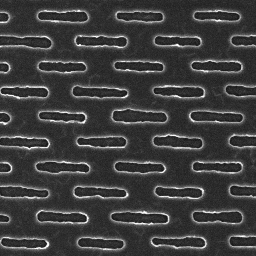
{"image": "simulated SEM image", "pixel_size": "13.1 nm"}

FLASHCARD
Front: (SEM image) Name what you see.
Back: a regular array of holes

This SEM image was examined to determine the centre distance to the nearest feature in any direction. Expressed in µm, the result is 0.592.